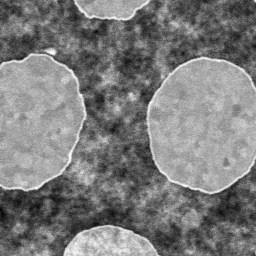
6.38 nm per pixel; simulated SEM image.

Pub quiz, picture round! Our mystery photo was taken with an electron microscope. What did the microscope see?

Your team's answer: raised bodies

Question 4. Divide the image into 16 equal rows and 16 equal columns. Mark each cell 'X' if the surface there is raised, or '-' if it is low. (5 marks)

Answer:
-----XXXX-------
----------------
----------------
--X-------------
XXXX-------XXXX-
XXXXX-----XXXXXX
XXXXX----XXXXXXX
XXXXX----XXXXXXX
XXXXX----XXXXXXX
XXXXX-----XXXXXX
XXXX------XXXXXX
XXX--------XXX--
----------------
----------------
-------X--------
----XX----------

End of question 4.